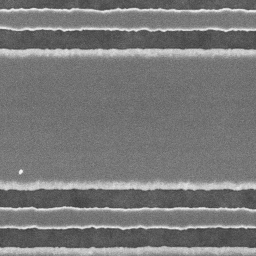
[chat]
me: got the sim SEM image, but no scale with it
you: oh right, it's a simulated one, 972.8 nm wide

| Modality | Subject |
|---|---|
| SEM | lines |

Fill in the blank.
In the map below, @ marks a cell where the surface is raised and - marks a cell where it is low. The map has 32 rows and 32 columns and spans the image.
--------------------------------
@@@@@@@@@@@@@@@@@@@@@@@@@@@@@@@@
@@@@@@@@@@@@@@@@@@@@@@@@@@@@@@@@
@@@@@@@@@@@@@@@@@@@@@@@@@@@@@@@@
--------------------------------
--------------------------------
@@@@@@@@@@@@@@@@@@@@@@@@@@@@@@@@
@@@@@@@@@@@@@@@@@@@@@@@@@@@@@@@@
@@@@@@@@@@@@@@@@@@@@@@@@@@@@@@@@
@@@@@@@@@@@@@@@@@@@@@@@@@@@@@@@@
@@@@@@@@@@@@@@@@@@@@@@@@@@@@@@@@
@@@@@@@@@@@@@@@@@@@@@@@@@@@@@@@@
@@@@@@@@@@@@@@@@@@@@@@@@@@@@@@@@
@@@@@@@@@@@@@@@@@@@@@@@@@@@@@@@@
@@@@@@@@@@@@@@@@@@@@@@@@@@@@@@@@
@@@@@@@@@@@@@@@@@@@@@@@@@@@@@@@@
@@@@@@@@@@@@@@@@@@@@@@@@@@@@@@@@
@@@@@@@@@@@@@@@@@@@@@@@@@@@@@@@@
@@@@@@@@@@@@@@@@@@@@@@@@@@@@@@@@
@@@@@@@@@@@@@@@@@@@@@@@@@@@@@@@@
@@@@@@@@@@@@@@@@@@@@@@@@@@@@@@@@
@@@@@@@@@@@@@@@@@@@@@@@@@@@@@@@@
@@@@@@@@@@@@@@@@@@@@@@@@@@@@@@@@
@@@@@@@@@-@-@@@@@@@@@@@@@@@@@@@@
--------------------------------
--------------------------------
@@@@@@@@@@@@@@@@@@@@@@@@@@@@@@@@
@@@@@@@@@@@@@@@@@@@@@@@@@@@@@@@@
--@@-@@@@------@@-@--@@@--------
--------------------------------
--------------------------------
@@@@@@@@@@@@@@@@@@@@@@@@@@@@@@@@